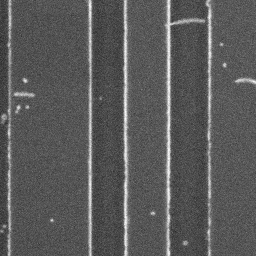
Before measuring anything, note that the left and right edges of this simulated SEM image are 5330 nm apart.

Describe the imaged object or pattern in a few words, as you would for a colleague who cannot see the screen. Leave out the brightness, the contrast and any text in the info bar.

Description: lines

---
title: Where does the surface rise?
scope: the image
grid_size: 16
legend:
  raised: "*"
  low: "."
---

.*****..***..***
.*****..***..***
.*****..***..***
.*****..***..***
.*****..***..***
.*****..***..***
.*****..***..***
.*****..***..***
.*****..***..***
.*****..***..***
.*****..***..***
.*****..***..***
.*****..***..***
.*****..***..***
.*****..***..***
.*****..***..***